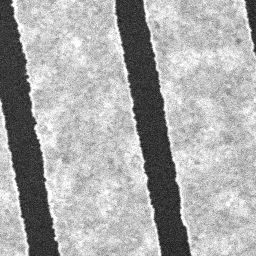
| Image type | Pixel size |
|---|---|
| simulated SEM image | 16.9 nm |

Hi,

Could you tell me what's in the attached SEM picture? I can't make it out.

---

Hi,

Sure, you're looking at one or a few lines or trenches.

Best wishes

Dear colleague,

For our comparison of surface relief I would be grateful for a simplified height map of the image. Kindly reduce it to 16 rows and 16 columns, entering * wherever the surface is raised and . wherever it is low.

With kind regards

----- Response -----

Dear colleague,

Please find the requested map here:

.******..******.
.******..*******
.******...******
..******..******
..******..******
..******..******
..******..******
..******..******
..*******..*****
*..******..*****
*..******..*****
*..******..*****
*..******..*****
*..*******.*****
**.*******..****
**..******..****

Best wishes